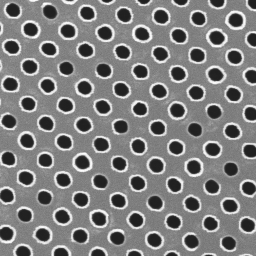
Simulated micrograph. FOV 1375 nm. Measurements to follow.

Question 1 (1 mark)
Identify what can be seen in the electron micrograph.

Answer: a regular array of holes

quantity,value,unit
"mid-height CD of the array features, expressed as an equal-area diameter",68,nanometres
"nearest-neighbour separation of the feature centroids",139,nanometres